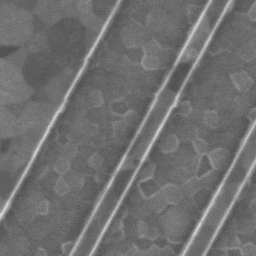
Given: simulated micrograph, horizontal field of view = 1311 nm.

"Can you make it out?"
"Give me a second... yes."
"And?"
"one or a few lines or trenches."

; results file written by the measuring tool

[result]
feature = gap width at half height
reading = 411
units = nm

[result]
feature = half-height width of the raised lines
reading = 91.4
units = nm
